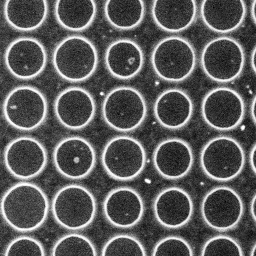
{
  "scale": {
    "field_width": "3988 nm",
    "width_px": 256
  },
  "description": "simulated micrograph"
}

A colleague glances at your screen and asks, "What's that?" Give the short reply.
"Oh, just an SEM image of a regular array of holes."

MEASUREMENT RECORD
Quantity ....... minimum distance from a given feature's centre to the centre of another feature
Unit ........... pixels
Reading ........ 49.1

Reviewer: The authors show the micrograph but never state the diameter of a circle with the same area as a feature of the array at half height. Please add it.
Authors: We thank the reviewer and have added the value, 594 nm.